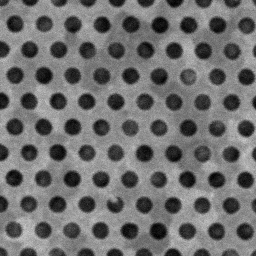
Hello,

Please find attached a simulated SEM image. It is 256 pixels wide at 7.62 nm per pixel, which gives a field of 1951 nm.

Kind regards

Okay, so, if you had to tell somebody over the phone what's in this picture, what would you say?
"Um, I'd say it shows a regular array of holes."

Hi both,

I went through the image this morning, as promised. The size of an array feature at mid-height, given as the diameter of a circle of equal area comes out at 137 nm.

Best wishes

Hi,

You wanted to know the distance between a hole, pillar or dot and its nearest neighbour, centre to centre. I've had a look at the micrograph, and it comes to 219 nanometers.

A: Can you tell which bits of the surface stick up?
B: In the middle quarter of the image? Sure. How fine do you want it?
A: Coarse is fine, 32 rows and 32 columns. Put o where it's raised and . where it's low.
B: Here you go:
oooooooooooooooooooooooooooooooo
....oooo...oooo...oooo...ooooo..
....ooo.....oo.....ooo....ooo...
....ooo.....oo.....ooo....ooo...
o...oooo...oooo...oooo....ooo...
oooooooooooooooooooooooooooooooo
oooooooooooooooooooooooooooooooo
oooo...ooooo..ooooo..ooooo..oooo
.ooo....ooo....ooo....ooo....ooo
.oo.....ooo....ooo.....oo.....oo
.ooo....ooo....ooo....ooo.....oo
ooooo.oooooo..ooooo..ooooo...ooo
oooooooooooooooooooooooooooooooo
oo.ooooooooooooooooooooooooooooo
....oooo...oooo...oooo...oooo...
....ooo.....oo.....oo.....ooo...
....ooo.....oo.....oo.....ooo...
o...oooo...oooo...oooo....ooo...
oooooooooooooooooooooooooooooooo
oooooooooooooooooooooooooooooooo
oooo...oooo...ooooo..ooooo..oooo
.ooo....ooo....ooo....ooo....ooo
.ooo....ooo....ooo....ooo.....oo
oooo....ooo....ooo....ooo....ooo
ooooo.ooooooo.ooooo..oooooo.oooo
oooooooooooooooooooooooooooooooo
oooooooooooooooo.ooooooooooooooo
....ooo....oooo...oooo...oooo...
....ooo....ooo.....oo.....ooo...
....ooo....ooo.....ooo....ooo...
o..ooooo...oooo...oooo...oooo...
oooooooooooooooooooooooooooooooo